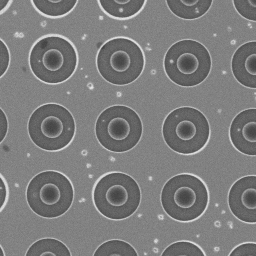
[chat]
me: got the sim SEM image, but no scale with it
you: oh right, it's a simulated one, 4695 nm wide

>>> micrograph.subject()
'an array of small figures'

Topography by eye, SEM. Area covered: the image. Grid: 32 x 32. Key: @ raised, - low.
-@@@-----@@@------@@@-----@@@---
@@@@@----@@@@----@@@@@----@@@@--
@@@@@@@@@@@@@@@@@@@@@@@@@@@@@@@-
@@@@@@@@@@@@@@@@@@@@@@@@@@@@@@@@
@@@@@@-@@@@@@@@@@@@@@@@@@@@@@@@@
-@@@-----@@@@----@@@@@---@@@@@@-
-@@@-----@@@------@@@-----@@@---
-@@@------@@------@@@-----@@@---
-@@@-----@@@------@@@-----@@@---
@@@@@----@@@@----@@@@-----@@@---
@@@@@@-@@@@@@@--@@@@@@---@@@@@--
@@@@@@@@@@@@@@@@@@@@@@@@@@@@@@@@
@@@@@@@@@@@@@@@@@@@@@@@@@@@@@@@@
@@@@@---@@@@@@--@@@@@@--@@@@@@@@
-@@@-----@@@-----@@@@-----@@@@--
-@@@-----@@@------@@------@@@---
-@@@-----@@@------@@------@@@---
@@@@-----@@@-----@@@@-----@@@---
@@@@@---@@@@@---@@@@@----@@@@---
@@@@@@@@@@@@@@@@@@@@@@@@@@@@@@@@
@@@@@@@@@@@@@@@@@@@@@@@@@@@@@@@@
@@@@@--@@@@@@@@@@@@@@@@@@@@@@@@@
@@@@-----@@@-----@@@@----@@@@@--
-@@------@@@-----@@@------@@@---
-@@------@@@------@@------@@@---
-@@@-----@@@-----@@@------@@@---
@@@@----@@@@-----@@@@----@@@@---
@@@@@@@@@@@@@@@@@@@@@@--@@@@@@--
@@@@@@@@@@@@@@@@@@@@@@@@@@@@@@@@
@@@@@@@@@@@@@@@@@@@@@@@@@@@@@@@@
@@@@----@@@@@---@@@@@@--@@@@@@--
@@@------@@@-----@@@-----@@@@---